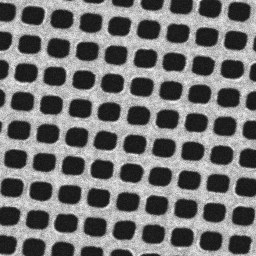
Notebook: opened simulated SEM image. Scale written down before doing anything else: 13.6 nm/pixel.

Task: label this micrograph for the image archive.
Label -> a regular array of holes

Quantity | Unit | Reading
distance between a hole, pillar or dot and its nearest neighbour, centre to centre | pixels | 28.8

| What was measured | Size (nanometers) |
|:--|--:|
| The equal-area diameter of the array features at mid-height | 307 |